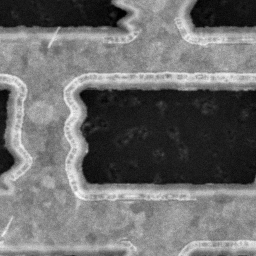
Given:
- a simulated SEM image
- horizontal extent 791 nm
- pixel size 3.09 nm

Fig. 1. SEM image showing one or a few lines or trenches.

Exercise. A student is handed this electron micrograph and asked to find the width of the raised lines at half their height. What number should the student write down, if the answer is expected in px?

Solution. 55.8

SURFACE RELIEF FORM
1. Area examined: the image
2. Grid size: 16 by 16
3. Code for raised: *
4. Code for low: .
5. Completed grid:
........***.....
........****....
****************
****************
****************
.****...........
.****...........
.****...........
.****...........
.****...........
.****...........
.****...........
****************
****************
****************
****************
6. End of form